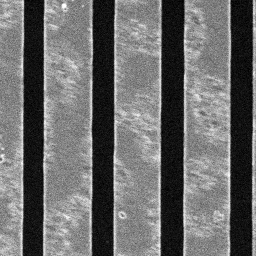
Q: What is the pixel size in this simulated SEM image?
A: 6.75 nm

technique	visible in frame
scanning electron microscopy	wiring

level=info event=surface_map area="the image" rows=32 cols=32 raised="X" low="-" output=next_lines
XXX---XXXXX---XXXXXX---XXXXXX---
XXX---XXXXX---XXXXXX---XXXXXX---
XXX---XXXXX---XXXXXX---XXXXXX---
XXX---XXXXX---XXXXXX---XXXXXX---
XXX---XXXXX---XXXXXX---XXXXXX---
XXX---XXXXXX--XXXXXX---XXXXXX---
XXX---XXXXXX--XXXXXX---XXXXXX---
XXX---XXXXXX--XXXXXX---XXXXXX---
XXX---XXXXX---XXXXXX---XXXXXX---
XXX---XXXXX---XXXXXX---XXXXXX---
XXX---XXXXX---XXXXXX---XXXXXX---
XXX---XXXXX---XXXXXX---XXXXXX---
XXX---XXXXX---XXXXXX---XXXXXX---
XXX---XXXXX---XXXXXX---XXXXXX---
XXX---XXXXX---XXXXXX---XXXXXX---
XXX---XXXXX---XXXXXX---XXXXXX---
XXX---XXXXX---XXXXXX---XXXXXX---
XXX---XXXXX---XXXXXX---XXXXXX---
XXX---XXXXX---XXXXXX---XXXXXX---
XXX---XXXXX---XXXXXX---XXXXXX---
XXX---XXXXX---XXXXXX---XXXXXX---
XXX---XXXXX---XXXXXX---XXXXXX---
XXX---XXXXX---XXXXXX---XXXXXX---
XXX---XXXXX---XXXXXX---XXXXXX---
XXX---XXXXX---XXXXXX---XXXXXX---
XXX---XXXXX---XXXXXX---XXXXXX---
XXX---XXXXX---XXXXXX---XXXXXX---
XXX---XXXXX---XXXXXX---XXXXXX---
XXX---XXXXX---XXXXXX---XXXXXX---
XXX---XXXXX---XXXXXX---XXXXXX---
XXX---XXXXX---XXXXXX---XXXXXX---
XXX---XXXXX---XXXXXX---XXXXXX---